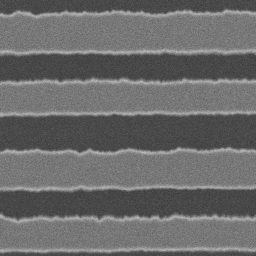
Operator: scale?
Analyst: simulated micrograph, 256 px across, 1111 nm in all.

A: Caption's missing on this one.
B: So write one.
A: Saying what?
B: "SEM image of lines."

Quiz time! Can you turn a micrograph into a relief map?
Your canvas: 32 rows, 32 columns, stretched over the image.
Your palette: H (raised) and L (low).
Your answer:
LLLLLLLLLLLLLLLLLLLLLLLLLLLLLLLL
LLLLLLLLLLLLLLHLLLLLLLLHLLLLHHLL
HHHHHHHHHHHHHHHHHHHHHHHHHHHHHHHH
HHHHHHHHHHHHHHHHHHHHHHHHHHHHHHHH
HHHHHHHHHHHHHHHHHHHHHHHHHHHHHHHH
HHHHHHHHHHHHHHHHHHHHHHHHHHHHHHHH
HHHHHHHHHHHHHHHHHHHHHHHHHHHHHHHH
LLLLLLLLLLLLLLLLLLLLLLLLLLLLLLLL
LLLLLLLLLLLLLLLLLLLLLLLLLLLLLLLL
LLLLLLLLLLLLLLLLLLLLLLLLLLLLLLLL
HHHHHHHHHHHHHHHHHHHHHHHHHHHHHHHH
HHHHHHHHHHHHHHHHHHHHHHHHHHHHHHHH
HHHHHHHHHHHHHHHHHHHHHHHHHHHHHHHH
HHHHHHHHHHHHHHHHHHHHHHHHHHHHHHHH
LLLLLLLLLLLLLLLLLLLLLLLLLLLLLLLL
LLLLLLLLLLLLLLLLLLLLLLLLLLLLLLLL
LLLLLLLLLLLLLLLLLLLLLLLLLLLLLLLL
LLLLLLLLLLLLLLLLLLLLLLLLLLLLLLLL
LLLLLLLLLLLLLLLLLLLLLLLLLLLLLLLL
HHHHHHHHHHHHHHHHHHHHHHHHHHHHHHHH
HHHHHHHHHHHHHHHHHHHHHHHHHHHHHHHH
HHHHHHHHHHHHHHHHHHHHHHHHHHHHHHHH
HHHHHHHHHHHHHHHHHHHHHHHHHHHHHHHH
HHHHHHHHHHHHHHHHHHHLHHHHHHHHHHHH
LLLLLLLLLLLLLLLLLLLLLLLLLLLLLLLL
LLLLLLLLLLLLLLLLLLLLLLLLLLLLLLLL
LLLLLLLLLLLLLLLLLLLLLLLLLLLLLLLL
HHHHHHHHHHHHHHHHHHHHHHHHHHHHHHHH
HHHHHHHHHHHHHHHHHHHHHHHHHHHHHHHH
HHHHHHHHHHHHHHHHHHHHHHHHHHHHHHHH
HHHHHHHHHHHHHHHHHHHHHHHHHHHHHHHH
LLLLLLLLLLLLLLLLLLLLLLLLLLLLLLLL